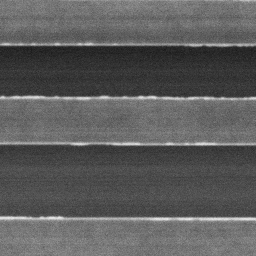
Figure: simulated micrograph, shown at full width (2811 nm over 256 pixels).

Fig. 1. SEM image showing lines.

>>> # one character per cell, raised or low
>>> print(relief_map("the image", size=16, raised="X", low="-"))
XXXXXXXXXXXXXXXX
XXXXXXXXXXXXXXXX
XXXXXXXXXXXXXXXX
----------------
----------------
----------------
XXXXXXXXXXXXXXXX
XXXXXXXXXXXXXXXX
XXXXXXXXXXXXXXXX
----------------
----------------
----------------
----------------
----------------
XXXXXXXXXXXXXXXX
XXXXXXXXXXXXXXXX